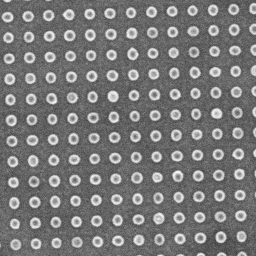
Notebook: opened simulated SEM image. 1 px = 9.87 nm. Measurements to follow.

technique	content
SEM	a regular array of raised bodies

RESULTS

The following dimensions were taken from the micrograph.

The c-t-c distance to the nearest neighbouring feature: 201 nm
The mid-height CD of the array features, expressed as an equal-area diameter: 0.0984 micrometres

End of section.